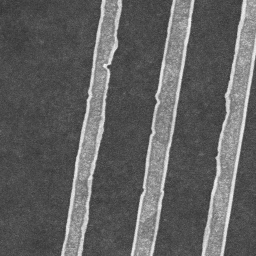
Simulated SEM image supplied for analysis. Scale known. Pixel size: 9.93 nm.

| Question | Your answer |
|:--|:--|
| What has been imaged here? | one or a few lines or trenches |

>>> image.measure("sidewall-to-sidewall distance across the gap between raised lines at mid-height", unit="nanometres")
506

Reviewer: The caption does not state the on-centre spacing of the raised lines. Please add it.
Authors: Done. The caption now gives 693 nanometers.